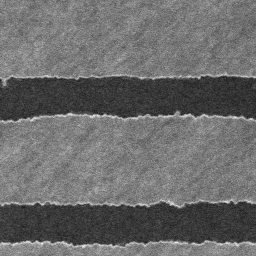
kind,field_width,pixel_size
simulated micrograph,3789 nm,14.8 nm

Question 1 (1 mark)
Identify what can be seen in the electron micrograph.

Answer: one or a few lines or trenches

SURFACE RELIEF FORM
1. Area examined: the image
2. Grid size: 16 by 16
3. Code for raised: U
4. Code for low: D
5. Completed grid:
UUUUUUUUUUUUUUUU
UUUUUUUUUUUUUUUU
UUUUUUUUUUUUUUUU
UUUUUUUUUUUUUUUU
UUUUUUUUUUUUUUUU
DDDDDDDUDDDDDDDD
DDDDDDDDDDDDDDDD
DUUUUUUUUUUUUUUU
UUUUUUUUUUUUUUUU
UUUUUUUUUUUUUUUU
UUUUUUUUUUUUUUUU
UUUUUUUUUUUUUUUU
UUUUUUUUUUUUUUUU
DDDDDDDDDDDDDDDD
DDDDDDDDDDDDDDDD
UUUUUUUUUUUUUUUU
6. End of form